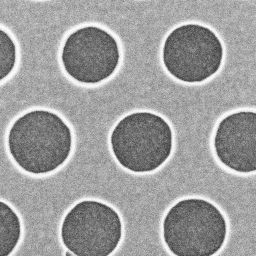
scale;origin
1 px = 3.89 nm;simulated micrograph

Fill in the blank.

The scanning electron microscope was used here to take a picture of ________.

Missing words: holes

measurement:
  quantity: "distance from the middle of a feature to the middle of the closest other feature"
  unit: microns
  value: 0.392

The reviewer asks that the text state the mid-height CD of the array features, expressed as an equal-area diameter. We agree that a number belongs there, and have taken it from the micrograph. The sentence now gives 235 nm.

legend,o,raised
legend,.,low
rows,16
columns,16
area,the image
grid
oooooooooooooooo
oooooooooooooooo
.ooo...ooo....oo
.ooo...ooo....oo
.ooo...oooo..ooo
oooooooooooooooo
oooooooooooooooo
o...oooo..oooo..
o...ooo....oo...
o...ooo....oo...
o...oooo..oooo..
oooooooooooooooo
oooooooooooo.ooo
.ooo...ooo....oo
.ooo....oo....oo
.ooo...oooo...oo